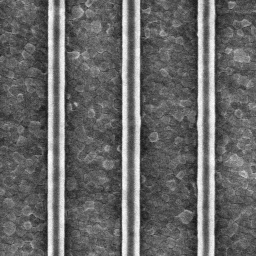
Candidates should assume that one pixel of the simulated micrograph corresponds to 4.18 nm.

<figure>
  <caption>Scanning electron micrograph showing one or a few lines or trenches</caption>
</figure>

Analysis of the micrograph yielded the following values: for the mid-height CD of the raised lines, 0.0549 µm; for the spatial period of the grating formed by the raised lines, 74.9 px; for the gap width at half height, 259 nm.